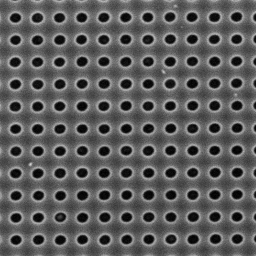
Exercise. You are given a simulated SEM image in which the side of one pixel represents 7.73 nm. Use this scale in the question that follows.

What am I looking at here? a regular array of holes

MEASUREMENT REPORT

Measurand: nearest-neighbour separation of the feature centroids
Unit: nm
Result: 169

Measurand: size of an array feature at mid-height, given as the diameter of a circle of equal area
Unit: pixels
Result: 10.9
